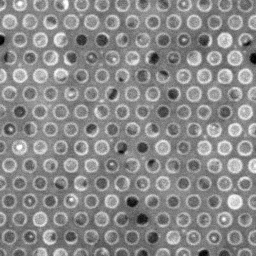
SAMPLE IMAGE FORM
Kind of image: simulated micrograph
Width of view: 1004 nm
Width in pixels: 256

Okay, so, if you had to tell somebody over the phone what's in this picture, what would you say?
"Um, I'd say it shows a regular array of raised bodies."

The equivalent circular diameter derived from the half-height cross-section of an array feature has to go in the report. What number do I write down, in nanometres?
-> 53.9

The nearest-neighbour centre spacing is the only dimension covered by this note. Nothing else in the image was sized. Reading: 79.8 nm